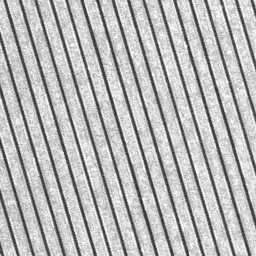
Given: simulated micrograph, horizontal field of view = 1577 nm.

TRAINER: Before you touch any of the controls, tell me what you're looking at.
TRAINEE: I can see parallel lines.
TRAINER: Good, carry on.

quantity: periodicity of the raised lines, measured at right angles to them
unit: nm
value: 91.3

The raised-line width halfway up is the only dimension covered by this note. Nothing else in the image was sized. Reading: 0.068 microns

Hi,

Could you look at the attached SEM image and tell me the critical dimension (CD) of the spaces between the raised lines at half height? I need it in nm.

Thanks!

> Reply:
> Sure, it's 25.9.